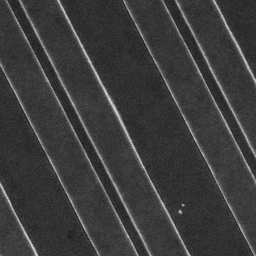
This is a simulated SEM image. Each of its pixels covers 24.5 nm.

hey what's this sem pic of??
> lines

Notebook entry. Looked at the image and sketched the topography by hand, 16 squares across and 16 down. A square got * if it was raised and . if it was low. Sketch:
****....******..
****....******..
*****....******.
*****....******.
******....******
.*****.....*****
.******....*****
..*****.....****
..******....****
...*****.....***
...******....***
....******....**
*...******....**
*....******....*
**...******....*
**....******....